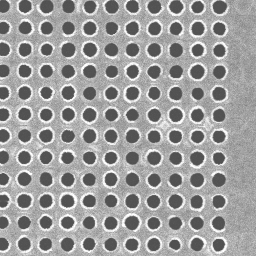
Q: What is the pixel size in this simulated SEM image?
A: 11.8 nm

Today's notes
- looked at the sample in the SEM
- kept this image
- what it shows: a regular array of holes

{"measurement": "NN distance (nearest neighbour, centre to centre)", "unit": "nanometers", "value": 250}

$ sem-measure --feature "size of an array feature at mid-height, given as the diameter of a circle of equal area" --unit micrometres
0.152